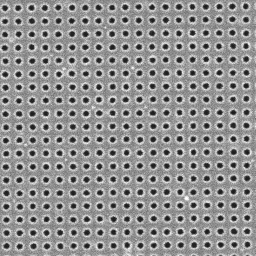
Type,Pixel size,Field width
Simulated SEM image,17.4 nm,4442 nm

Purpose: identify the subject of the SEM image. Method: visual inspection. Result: a regular array of holes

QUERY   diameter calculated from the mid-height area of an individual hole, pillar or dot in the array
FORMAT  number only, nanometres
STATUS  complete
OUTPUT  111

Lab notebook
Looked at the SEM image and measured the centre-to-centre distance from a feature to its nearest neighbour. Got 222 nm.